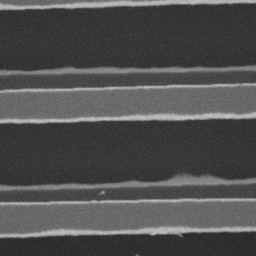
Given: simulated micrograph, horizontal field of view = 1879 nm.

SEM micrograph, lines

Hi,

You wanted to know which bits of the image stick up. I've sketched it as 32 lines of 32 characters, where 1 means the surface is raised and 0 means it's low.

11111111111111111111100000000000
00000000000000000000000000000000
00000000000000000000000000000000
00000000000000000000000000000000
00000000000000000000000000000000
00000000000000000000000000000000
00000000000000000000000000000000
00000000000000000000000000000000
00000000000000000000000000000000
11111111111111111111111111111111
11111111111111111111111111111111
11111111111111111111111111111111
11111111111111111111111111111111
11111111111111111111111111111111
11111111111111111111111111111111
00000000000000000000000000000000
00000000000000000000000000000000
00000000000000000000000000000000
00000000000000000000000000000000
00000000000000000000000000000000
00000000000000000000000000000000
00000000000000000000000000000000
00000000000000000000000000000000
00000000001111111111111111111111
11111111111111111111111111111111
11111111111111111111111111111111
11111111111111111111111111111111
11111111111111111111111111111111
11111111111111111111111111111111
11111100000000000000000000000000
00000000000000000000000000000000
00000000000000000000000000000000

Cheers